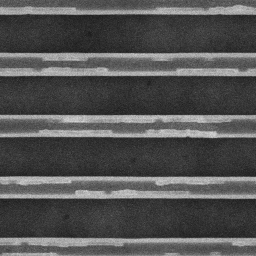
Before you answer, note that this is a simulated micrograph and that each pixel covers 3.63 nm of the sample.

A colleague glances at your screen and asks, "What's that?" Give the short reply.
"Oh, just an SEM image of parallel lines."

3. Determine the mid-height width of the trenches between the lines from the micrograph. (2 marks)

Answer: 0.154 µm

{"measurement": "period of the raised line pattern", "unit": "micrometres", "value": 0.224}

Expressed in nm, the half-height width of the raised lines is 69.9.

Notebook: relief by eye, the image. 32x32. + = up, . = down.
++++++++++++++++++++++++++++++++
....................++++++++++++
................................
................................
................................
................................
................................
++++++++++++++++++++++++++++++++
++++++++++++++++++++++++++++++++
................................
................................
................................
................................
................................
................................
++++++++++++++++++++++++++++++++
++++++++++++++++++++++++++++++++
................................
................................
................................
................................
................................
++++++++++++++++++++++++++++++++
++++++++++++++++++++++++++++++++
++++++++++++++..........++++++++
................................
................................
................................
................................
................................
++++++++++++++++++++++++++++++++
++++++++++++++++++++++++++++++++